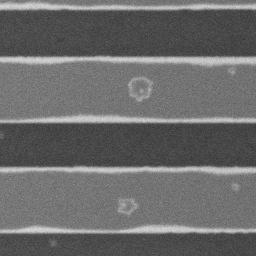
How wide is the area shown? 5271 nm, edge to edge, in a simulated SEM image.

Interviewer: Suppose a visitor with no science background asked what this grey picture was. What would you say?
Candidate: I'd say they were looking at lines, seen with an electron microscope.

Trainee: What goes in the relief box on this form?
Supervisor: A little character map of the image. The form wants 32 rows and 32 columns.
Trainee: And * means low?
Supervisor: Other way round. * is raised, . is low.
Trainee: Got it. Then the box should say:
********************************
................................
................................
................................
................................
................................
................................
********************************
********************************
********************************
********************************
********************************
********************************
********************************
********************************
................................
................................
................................
................................
................................
................................
********************************
********************************
********************************
********************************
********************************
********************************
********************************
********************************
................................
................................
................................